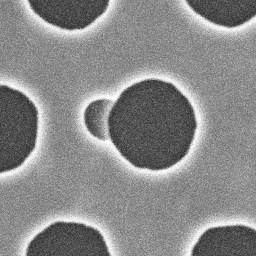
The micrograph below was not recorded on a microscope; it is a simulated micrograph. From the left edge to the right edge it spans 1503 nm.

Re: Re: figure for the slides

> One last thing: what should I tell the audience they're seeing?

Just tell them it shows holes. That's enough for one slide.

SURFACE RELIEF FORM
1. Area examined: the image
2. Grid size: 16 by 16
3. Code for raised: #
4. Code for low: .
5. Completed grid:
##.....#####....
###...#######..#
################
################
################
.#######...#####
..####......####
..###.......####
..####......####
..#####.....####
.########.######
################
################
################
###...#######...
##.....#####....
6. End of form